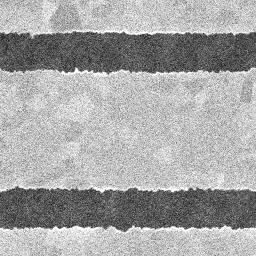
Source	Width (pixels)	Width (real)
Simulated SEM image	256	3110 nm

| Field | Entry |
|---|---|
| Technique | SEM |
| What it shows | one or a few lines or trenches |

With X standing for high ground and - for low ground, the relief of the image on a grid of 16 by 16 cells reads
XXXXXXXXXXXXXXXX
XXXXXXXXXXXXXXXX
----------------
----------------
XXXX-X---------X
XXXXXXXXXXXXXXXX
XXXXXXXXXXXXXXXX
XXXXXXXXXXXXXXXX
XXXXXXXXXXXXXXXX
XXXXXXXXXXXXXXXX
XXXXXXXXXXXXXXXX
XXXXXXXXXXXXXXXX
----------------
----------------
XXXXXXXXXXXXXXXX
XXXXXXXXXXXXXXXX